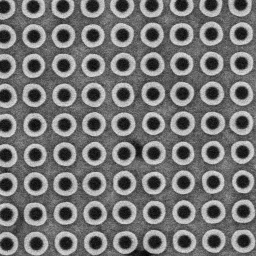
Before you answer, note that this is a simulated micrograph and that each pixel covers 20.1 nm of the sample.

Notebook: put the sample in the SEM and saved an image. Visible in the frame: an array of small figures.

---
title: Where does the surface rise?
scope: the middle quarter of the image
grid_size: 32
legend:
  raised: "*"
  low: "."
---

***.******..******.******..*****
***..*****..*****..******..*****
**...****....***.....***....***.
................................
................................
**....***....****...****...*****
***..*****..*****...*****..*****
***.******..*****..******..*****
***.******..*****...*****..*****
**...*****...****...****...****.
......***.....**................
................................
*.....***.....**.....**.....***.
**...*****..*****...*****..*****
***..*****..******..*****..*****
***..*****..******..*****..*****
***..*****..*****...*****..*****
**....***....***.....**.....***.
................................
......................*.........
**....****...****...*****...****
***..*****..******..*****..*****
***..*****..******..*****..*****
***..*****..*****...*****..*****
**....****...****....***....****
................................
................................
**....***....****....***....****
***..*****..******..*****..*****
***..*****..******..*****..*****
***..*****..******..*****..*****
***..*****...****...*****..*****